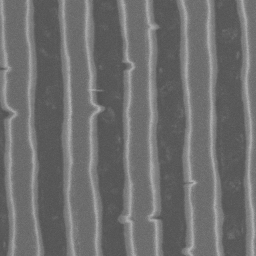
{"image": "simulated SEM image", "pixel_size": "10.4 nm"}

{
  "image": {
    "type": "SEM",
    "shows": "parallel lines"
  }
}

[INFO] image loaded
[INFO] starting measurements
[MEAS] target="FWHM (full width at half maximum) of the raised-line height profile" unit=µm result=0.296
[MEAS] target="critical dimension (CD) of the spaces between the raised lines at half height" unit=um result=0.325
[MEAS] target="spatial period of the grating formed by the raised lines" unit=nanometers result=626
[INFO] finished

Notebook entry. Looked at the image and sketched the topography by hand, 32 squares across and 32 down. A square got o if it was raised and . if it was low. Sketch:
oooo....ooo....oooo....ooo....oo
oooo....ooo....oooo....ooo....oo
oooo....ooo....oooo....ooo....oo
oooo....ooo....oooo....ooo.....o
oooo....ooo.....ooo....ooo.....o
oooo....ooo.....ooo....ooo.....o
oooo....ooo.....ooo....oooo....o
oooo....ooo.....ooo....oooo....o
oooo....oooo....ooo....oooo....o
oooo....oooo....ooo....oooo....o
oooo....oooo....ooo....oooo...oo
oooo....oooo....ooo....oooo....o
oooo....oooo....ooo....oooo....o
.ooo....ooooo...ooo....oooo....o
.ooo....oooo....ooo.....ooo....o
.ooo....oooo....ooo.....ooo....o
.ooo....oooo....ooo....oooo....o
.ooo....oooo....ooo....oooo....o
.ooo....oooo....ooo....oooo....o
.ooo....oooo....ooo....oooo....o
.oooo...oooo....ooo....oooo....o
.ooo....oooo....ooo....oooo....o
.ooo....oooo....ooo.....ooo....o
.ooo....oooo....oooo....ooo....o
.ooo....oooo....oooo...oooo....o
.ooo....oooo....oooo....ooo....o
..oo....oooo....oooo....ooo....o
..ooo...oooo...ooooo....ooo....o
..ooo....ooo....oooo....ooo....o
.oooo....ooo....oooo....ooo....o
.oooo....ooo....oooo....ooo....o
.oooo....ooo....oooo...ooooo...o